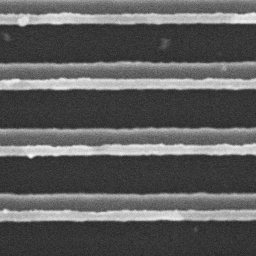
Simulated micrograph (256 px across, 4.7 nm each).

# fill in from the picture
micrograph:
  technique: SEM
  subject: lines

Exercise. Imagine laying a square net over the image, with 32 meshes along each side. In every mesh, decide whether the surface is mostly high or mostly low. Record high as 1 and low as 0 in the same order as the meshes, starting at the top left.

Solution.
11111111111111111111111111111111
11111111111111111111111111111111
11111111111111111111111111111111
00000000000000000000000000000000
00000000000000000000000000000000
00000000000000000000000000000000
00000000000000000000000000000000
00000000000000000000000000000000
11111111111111111111111111111111
11111111111111111111111111111111
11111111111111111111111111111111
00000000000000000000000000000000
00000000000000000000000000000000
00000000000000000000000000000000
00000000000000000000000000000000
00000000000000000000000000000000
11111111111111111111111111111111
11111111111111111111111111111111
11111111111111111111111111111111
00010000000000000000000000000000
00000000000000000000000000000000
00000000000000000000000000000000
00000000000000000000000000000000
00000000000000000000000000000000
11011111111111111111111111111111
11111111111111111111111111111111
11111111111111111111111111111111
11111111111111111111011011111111
00000000000000000000000000000000
00000000000000000000000000000000
00000000000000000000000000000000
00000000000000000000000000000000